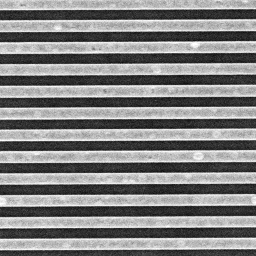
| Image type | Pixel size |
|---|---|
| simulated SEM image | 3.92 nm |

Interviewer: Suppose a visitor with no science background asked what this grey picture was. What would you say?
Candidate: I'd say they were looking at parallel lines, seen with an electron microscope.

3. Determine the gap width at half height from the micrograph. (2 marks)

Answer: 43.1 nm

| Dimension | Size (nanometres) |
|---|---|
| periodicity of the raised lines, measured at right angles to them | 85.5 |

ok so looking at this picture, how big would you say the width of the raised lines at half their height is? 0.0431 µm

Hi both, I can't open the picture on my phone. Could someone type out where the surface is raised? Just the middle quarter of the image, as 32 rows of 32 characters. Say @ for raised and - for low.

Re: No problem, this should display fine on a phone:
@@@@@@@@@@@@@@@@@@@@@@@@@@@@@@@@
@@@@@@@@@@@@@@@@@@@@@@@@@@@@@@@@
@@@@@@@@@@@@@@@@@@@@@@@@@@@@@@@@
--------------------------------
--------------------------------
--------------------------------
@@@@@@@@@@@@@@@@@@@@@@@@@@@@@@@@
@@@@@@@@@@@@@@@@@@@@@@@@@@@@@@@@
--------------------------------
--------------------------------
--------------------------------
@@@@@@@@@@@@@@@@@@@@@@@@@@@@@@@@
@@@@@@@@@@@@@@@@@@@@@@@@@@@@@@@@
@@@@@@@@@@@@@@@@@@@@@@@@@@@@@@@@
--------------------------------
--------------------------------
@@@@@@@@@@@@@@@@@@@@@@@@@@@@@@@@
@@@@@@@@@@@@@@@@@@@@@@@@@@@@@@@@
@@@@@@@@@@@@@@@@@@@@@@@@@@@@@@@@
--------------------------------
--------------------------------
--------------------------------
@@@@@@@@@@@@@@@@@@@@@@@@@@@@@@@@
@@@@@@@@@@@@@@@@@@@@@@@@@@@@@@@@
@@---@-----@@@@----@@----@@@@@@-
--------------------------------
--------------------------------
@@@@@@@@@@@@@@@@@@@@@@@@@@@@@@@@
@@@@@@@@@@@@@@@@@@@@@@@@@@@@@@@@
@@@@@@@@@@@@@@@@@@@@@@@@@@@@@@@@
--------------------------------
--------------------------------